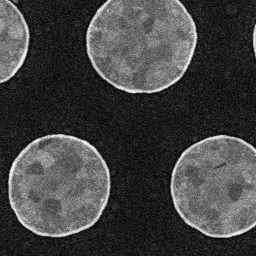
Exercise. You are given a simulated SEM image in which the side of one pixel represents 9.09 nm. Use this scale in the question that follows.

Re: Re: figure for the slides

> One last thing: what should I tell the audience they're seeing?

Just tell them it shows raised bodies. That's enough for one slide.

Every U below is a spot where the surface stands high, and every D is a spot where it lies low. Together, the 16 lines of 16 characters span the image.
UDDDDDUUUUUDDDDD
UUDDDDUUUUUUDDDD
UUDDDUUUUUUUDDDD
UDDDDDUUUUUUDDDD
UDDDDDUUUUUDDDDD
DDDDDDDDUUDDDDDD
DDDDDDDDDDDDDDDD
DDDDDDDDDDDDDDDD
DDDUDDDDDDDDDDDD
DUUUUUDDDDDDUUUU
DUUUUUUDDDDUUUUU
DUUUUUUDDDDUUUUU
DUUUUUUDDDDUUUUU
DUUUUUDDDDDUUUUU
DDUUUDDDDDDDDUUD
DDDDDDDDDDDDDDDD